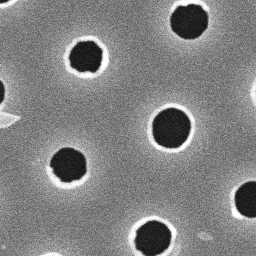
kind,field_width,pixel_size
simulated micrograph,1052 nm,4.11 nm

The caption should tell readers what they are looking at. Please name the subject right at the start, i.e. holes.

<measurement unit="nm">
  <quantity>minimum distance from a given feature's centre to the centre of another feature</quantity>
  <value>446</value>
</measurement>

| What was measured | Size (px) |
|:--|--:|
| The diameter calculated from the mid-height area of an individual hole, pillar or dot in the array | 36.5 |